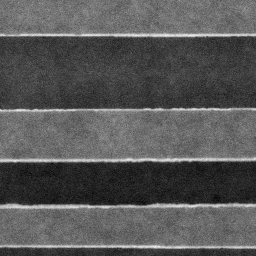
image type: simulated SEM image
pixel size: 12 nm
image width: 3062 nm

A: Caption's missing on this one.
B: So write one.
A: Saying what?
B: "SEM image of lines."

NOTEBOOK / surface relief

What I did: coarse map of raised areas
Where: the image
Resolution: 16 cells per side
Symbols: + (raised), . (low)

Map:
++++++++++++++++
++++++++++++++++
................
................
................
................
................
++++++++++++++++
++++++++++++++++
++++++++++++++++
................
................
................
++++++++++++++++
++++++++++++++++
................